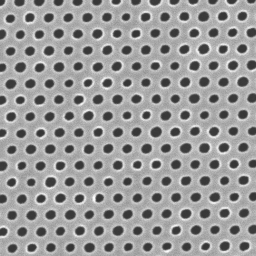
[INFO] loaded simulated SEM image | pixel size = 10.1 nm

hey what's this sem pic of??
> a regular array of holes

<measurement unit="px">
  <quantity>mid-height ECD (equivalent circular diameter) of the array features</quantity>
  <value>10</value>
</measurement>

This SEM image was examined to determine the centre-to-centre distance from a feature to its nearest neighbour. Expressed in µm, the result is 0.189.